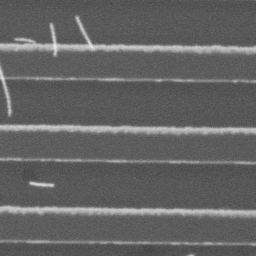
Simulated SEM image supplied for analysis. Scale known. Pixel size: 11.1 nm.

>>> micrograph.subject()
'lines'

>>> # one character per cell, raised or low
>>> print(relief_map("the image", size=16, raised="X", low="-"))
----------------
----------------
----------------
XXXXXXXXXXXXXXXX
XXXXXXXXXXXXXXXX
----------------
----------------
----------------
XXXXXXXXXXXXXXXX
XXXXXXXXXXXXXXXX
----------------
----------------
----------------
XXXXXXXXXXXXXXXX
XXXXXXXXXXXXXXXX
----------------